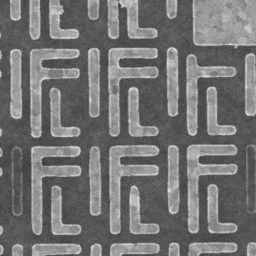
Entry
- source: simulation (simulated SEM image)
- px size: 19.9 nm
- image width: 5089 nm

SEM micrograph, wiring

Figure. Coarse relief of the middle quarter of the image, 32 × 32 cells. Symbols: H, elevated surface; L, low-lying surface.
LLLLLLHHHLLHHHLLLLLLLLLLLLHHLLLH
HHHHLLHHHLLHHHHHHHHHHHHLLLHHLLLH
HHHHLLHHHLLHHHHHHHHHHHHLLLHHLLLH
LLLLLLHHHLLHHHHLLLLLLLLLLLHHLLLH
LLLLLLHHHLLHHHLLLLLLLLLLLLHHLLLH
LLLLLLHHHLLHHHLLLLLLLLLLLLHHLLLH
LLLLLLLHHLLHHHLLHHLLLLLLLLHHLLLH
LLLLLLLHHLLHHHLLHHLLLLLLLLHHLLLH
LLLLLLLHHLLHHHLLHHLLLLLLLLHHLLLH
LLLLLLLHHLLHHHLLHHLLLLLLLLHHLLLH
LLLLLLLHHLLHHHLLHHLLLLLLLLHHLLLH
LLLLLLLHHLLHHHLLHHLLLLLLLLHHLLLH
LLLLLLLHHLLHHHLLHHLLLLLLLLHHLLLH
LLLLLLLLLLLHHHLLHHLLLLLLLLLLLLLH
LLLLLLLLLLLHHHLLHHHLLLLLLLLLLLLH
LLLLLLLLLLLHHHLLLHHLLLLLLLLLLLLH
HHHHLLLLLLLLHHLLLHHHHHHLLLLLLLLH
HHHHLLLLLLLLHHLLLHHHHHHLLLLLLLLL
LLLLLLLLLLLLLLLLLLLLLLLLLLLLLLLL
LLLLLLLLLLLLLLLLLLLLLLLLLLLLLLLL
LLLLLLLLLLLLLLLLHHHHHHHLLLLHLLLH
HHHHLLLHHLLLHHHHHHHHHHHLLLHHLLLH
HHHHLLLHHLLLHHHHHHHHHHHLLLHHHLLH
LLLLLLLHHLLLHHLLLLLLLLLLLLHHHLLH
LLLLLLLHHLLLHHLLLLLLLLLLLLHHHLLH
LLLLLLLHHLLLHHHLLLLLLLLLLLHHLLLH
HHHHLLLHHLLLHHHHHHHHHHHLLLHHLLLH
HHHHLLLHHLLLHHHHHHHHHHHLLLHHHLLH
LLLLLLLHHLLLHHLLLLLLLLLLLLHHHLLH
LLLLLLLHHLLLHHLLLLLLLLLLLLHHHLLH
LLLLLLLHHLLLHHLLLLLLLLLLLLHHHLLH
LLLLLLLHHLLLHHLLLHLLLLLLLLHHHLLH